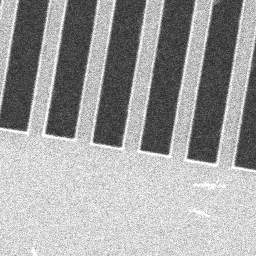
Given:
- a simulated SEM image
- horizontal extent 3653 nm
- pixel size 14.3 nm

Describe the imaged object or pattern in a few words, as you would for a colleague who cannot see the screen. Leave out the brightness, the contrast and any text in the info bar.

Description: parallel lines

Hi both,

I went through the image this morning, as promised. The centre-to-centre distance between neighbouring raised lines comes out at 680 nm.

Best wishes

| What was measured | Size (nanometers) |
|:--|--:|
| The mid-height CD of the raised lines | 463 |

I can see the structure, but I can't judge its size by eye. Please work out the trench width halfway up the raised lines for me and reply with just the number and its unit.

0.219 um